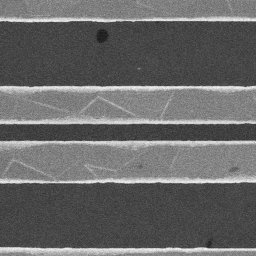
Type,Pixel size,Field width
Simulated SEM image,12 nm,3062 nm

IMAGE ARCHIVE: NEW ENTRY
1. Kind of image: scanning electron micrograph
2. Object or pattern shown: lines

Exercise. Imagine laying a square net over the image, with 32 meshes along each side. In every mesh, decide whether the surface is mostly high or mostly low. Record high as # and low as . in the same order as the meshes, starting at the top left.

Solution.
################################
################################
###################.#######....#
................................
................................
................................
................................
................................
................................
................................
................................
################################
################################
################################
################################
................................
................................
................................
################################
################################
################################
################################
################################
................................
................................
................................
................................
................................
................................
................................
................................
################################